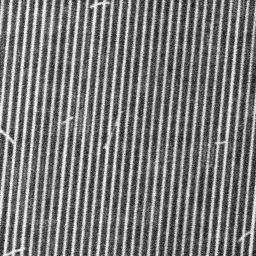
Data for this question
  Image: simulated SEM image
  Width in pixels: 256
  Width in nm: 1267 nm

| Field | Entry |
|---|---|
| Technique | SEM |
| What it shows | parallel lines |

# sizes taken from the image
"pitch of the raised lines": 41.7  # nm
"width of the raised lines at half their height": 0.0086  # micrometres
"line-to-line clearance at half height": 33.9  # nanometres